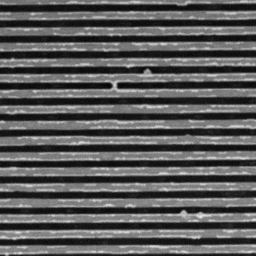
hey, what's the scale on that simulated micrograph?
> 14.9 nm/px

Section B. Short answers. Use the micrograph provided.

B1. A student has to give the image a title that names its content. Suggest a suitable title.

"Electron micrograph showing parallel lines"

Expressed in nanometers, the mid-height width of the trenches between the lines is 108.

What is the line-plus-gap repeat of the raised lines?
15.6 pixels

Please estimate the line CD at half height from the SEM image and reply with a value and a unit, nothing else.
121 nanometers